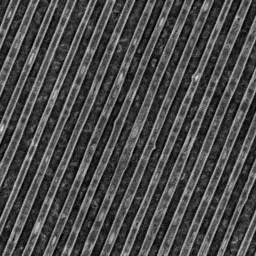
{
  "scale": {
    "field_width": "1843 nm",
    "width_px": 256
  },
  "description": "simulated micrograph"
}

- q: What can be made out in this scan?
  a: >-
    parallel lines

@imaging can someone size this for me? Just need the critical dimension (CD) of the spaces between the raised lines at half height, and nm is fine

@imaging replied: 74.1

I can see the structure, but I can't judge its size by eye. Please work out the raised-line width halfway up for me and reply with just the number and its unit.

7.53 pixels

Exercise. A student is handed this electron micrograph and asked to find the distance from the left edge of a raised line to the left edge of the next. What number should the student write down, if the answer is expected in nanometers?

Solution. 129